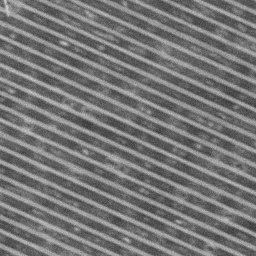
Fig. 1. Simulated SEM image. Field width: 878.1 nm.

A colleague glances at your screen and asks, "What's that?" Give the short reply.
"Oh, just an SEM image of parallel lines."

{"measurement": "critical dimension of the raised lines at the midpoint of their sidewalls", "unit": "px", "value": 3.44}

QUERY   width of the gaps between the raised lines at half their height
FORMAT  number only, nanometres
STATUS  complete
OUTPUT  32.9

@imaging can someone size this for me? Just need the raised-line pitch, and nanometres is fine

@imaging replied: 43.4